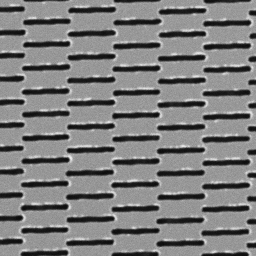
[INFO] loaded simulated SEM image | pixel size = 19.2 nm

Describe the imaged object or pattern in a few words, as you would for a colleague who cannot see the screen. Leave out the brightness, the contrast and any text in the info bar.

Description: a regular array of holes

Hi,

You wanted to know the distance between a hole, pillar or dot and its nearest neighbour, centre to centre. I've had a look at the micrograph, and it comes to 442 nm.